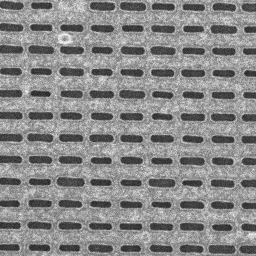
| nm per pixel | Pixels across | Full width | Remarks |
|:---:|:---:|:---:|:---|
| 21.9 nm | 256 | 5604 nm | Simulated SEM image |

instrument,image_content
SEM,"a regular array of holes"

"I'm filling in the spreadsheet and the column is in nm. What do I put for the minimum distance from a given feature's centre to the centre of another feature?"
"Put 480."